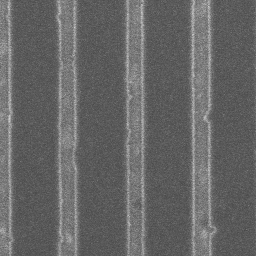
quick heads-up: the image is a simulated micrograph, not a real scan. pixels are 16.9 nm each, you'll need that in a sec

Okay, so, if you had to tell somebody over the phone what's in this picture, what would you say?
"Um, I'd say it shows one or a few lines or trenches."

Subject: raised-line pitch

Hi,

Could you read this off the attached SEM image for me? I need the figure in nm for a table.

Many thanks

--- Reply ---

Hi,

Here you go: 1120